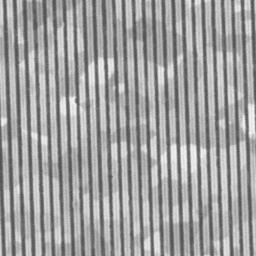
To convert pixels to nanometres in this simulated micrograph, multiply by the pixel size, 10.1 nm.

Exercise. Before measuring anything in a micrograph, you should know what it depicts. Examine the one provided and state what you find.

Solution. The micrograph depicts parallel lines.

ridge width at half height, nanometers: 37.9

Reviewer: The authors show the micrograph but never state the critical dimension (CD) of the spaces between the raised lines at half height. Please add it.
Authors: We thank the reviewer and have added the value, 58.1 nanometers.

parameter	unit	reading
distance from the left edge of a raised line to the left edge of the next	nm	100